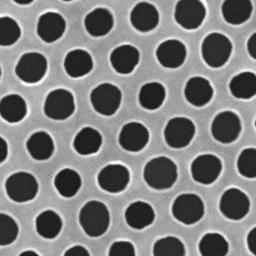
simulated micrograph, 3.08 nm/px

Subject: a regular array of holes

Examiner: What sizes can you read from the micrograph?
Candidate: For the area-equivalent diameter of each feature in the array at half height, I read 93.4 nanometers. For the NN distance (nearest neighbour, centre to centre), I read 45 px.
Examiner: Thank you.